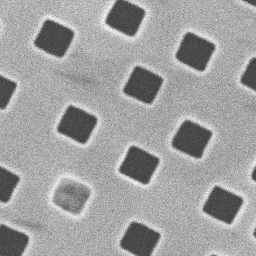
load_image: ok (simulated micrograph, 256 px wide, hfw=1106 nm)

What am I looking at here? holes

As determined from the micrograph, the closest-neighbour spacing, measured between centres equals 0.268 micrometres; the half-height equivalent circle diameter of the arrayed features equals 156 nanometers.